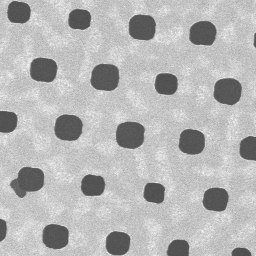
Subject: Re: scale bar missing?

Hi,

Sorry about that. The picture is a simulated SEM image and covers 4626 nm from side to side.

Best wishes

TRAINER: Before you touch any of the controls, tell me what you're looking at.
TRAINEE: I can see a regular array of holes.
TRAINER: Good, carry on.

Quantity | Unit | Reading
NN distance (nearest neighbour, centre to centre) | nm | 1120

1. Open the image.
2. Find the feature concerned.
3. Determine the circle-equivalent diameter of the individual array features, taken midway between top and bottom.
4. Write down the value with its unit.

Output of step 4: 482 nanometres